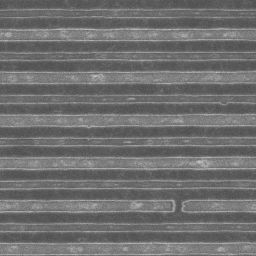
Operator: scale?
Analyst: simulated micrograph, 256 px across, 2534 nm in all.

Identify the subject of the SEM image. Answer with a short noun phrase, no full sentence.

parallel lines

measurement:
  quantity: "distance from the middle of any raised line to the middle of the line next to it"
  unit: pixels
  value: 21.4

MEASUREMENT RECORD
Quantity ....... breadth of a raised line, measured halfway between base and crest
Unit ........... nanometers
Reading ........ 131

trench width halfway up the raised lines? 79.2 nm